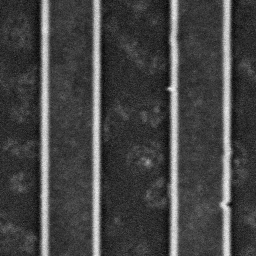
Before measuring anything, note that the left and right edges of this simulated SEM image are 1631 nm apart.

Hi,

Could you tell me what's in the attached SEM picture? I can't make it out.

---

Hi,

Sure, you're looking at one or a few lines or trenches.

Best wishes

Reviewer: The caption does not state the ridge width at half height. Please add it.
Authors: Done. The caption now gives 336 nm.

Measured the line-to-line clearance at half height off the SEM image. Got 77.4 px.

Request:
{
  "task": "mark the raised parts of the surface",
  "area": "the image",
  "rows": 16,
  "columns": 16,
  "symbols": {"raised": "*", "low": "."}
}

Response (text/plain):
...***.....***..
...***.....***..
...***.....***..
...***.....***..
...***.....***..
...***.....***..
...***.....***..
...***.....***..
...***.....***..
...***.....***..
...***.....***..
...***.....***..
...***.....***..
...***.....***..
...***.....***..
...***.....***..